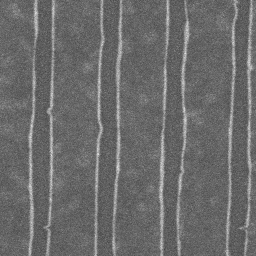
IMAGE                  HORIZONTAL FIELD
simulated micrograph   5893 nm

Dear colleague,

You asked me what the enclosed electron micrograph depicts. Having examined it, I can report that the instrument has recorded one or a few lines or trenches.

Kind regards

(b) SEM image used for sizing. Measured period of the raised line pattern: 1520 nanometres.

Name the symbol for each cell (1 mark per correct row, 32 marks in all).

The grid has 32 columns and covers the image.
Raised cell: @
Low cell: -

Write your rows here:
@@@@@--@@@@@@--@@@@@@--@@@@@@--@
@@@@@--@@@@@@--@@@@@@--@@@@@@--@
@@@@@--@@@@@@--@@@@@@--@@@@@@--@
@@@@@--@@@@@@--@@@@@@--@@@@@@--@
@@@@@--@@@@@@--@@@@@@--@@@@@@--@
@@@@---@@@@@@--@@@@@@--@@@@@@--@
@@@@---@@@@@@--@@@@@@--@@@@@@--@
@@@@---@@@@@@--@@@@@@--@@@@@@--@
@@@@---@@@@@---@@@@@@--@@@@@@--@
@@@@---@@@@@---@@@@@@--@@@@@@--@
@@@@---@@@@@---@@@@@@--@@@@@@--@
@@@@--@@@@@@---@@@@@@--@@@@@@--@
@@@@--@@@@@@---@@@@@@--@@@@@@--@
@@@@--@@@@@@---@@@@@@--@@@@@@--@
@@@@--@@@@@@---@@@@@---@@@@@@--@
@@@@--@@@@@@@--@@@@@---@@@@@@--@
@@@@--@@@@@@@--@@@@@---@@@@@@--@
@@@@--@@@@@@---@@@@@---@@@@@@--@
@@@@--@@@@@@---@@@@@---@@@@@@--@
@@@@--@@@@@@---@@@@@---@@@@@@--@
@@@@--@@@@@@---@@@@@---@@@@@@--@
@@@@--@@@@@@---@@@@@---@@@@@@--@
@@@@--@@@@@@---@@@@@---@@@@@@--@
@@@@--@@@@@@---@@@@@--@@@@@@@--@
@@@@--@@@@@@--@@@@@@--@@@@@@@--@
@@@@--@@@@@@--@@@@@@--@@@@@@@--@
@@@@--@@@@@@--@@@@@@--@@@@@@@--@
@@@@--@@@@@@--@@@@@@--@@@@@@@--@
@@@@--@@@@@@--@@@@@@--@@@@@@---@
@@@@--@@@@@@--@@@@@@--@@@@@@---@
@@@@--@@@@@@--@@@@@@--@@@@@@---@
@@@@--@@@@@@--@@@@@@--@@@@@@---@